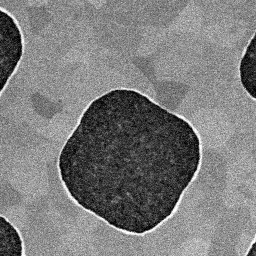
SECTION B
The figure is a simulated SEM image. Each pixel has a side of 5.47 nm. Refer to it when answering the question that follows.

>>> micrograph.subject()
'holes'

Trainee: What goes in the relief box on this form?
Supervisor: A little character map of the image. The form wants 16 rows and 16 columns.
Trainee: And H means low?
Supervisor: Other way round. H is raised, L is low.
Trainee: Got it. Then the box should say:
HHHHHHHHHHHHHHHH
LHHHHHHHHHHHHHHH
LHHHHHHHHHHHHHHH
LHHHHHHHHHHHHHHL
LHHHHHHHHHHHHHHL
HHHHHHHHHHHHHHHL
HHHHHHLLLLHHHHHH
HHHHHLLLLLLHHHHH
HHHHLLLLLLLLHHHH
HHHHLLLLLLLLLHHH
HHHHLLLLLLLLHHHH
HHHHLLLLLLLLHHHH
HHHHHLLLLLLHHHHH
HHHHHHLLLLLHHHHH
LHHHHHHHLHHHHHHH
LHHHHHHHHHHHHHHH